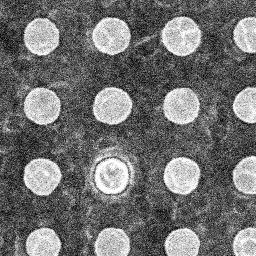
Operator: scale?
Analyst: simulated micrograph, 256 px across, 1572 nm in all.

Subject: a regular array of raised bodies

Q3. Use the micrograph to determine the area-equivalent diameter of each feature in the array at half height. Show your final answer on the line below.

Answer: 0.213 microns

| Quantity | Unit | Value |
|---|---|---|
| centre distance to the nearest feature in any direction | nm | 424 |